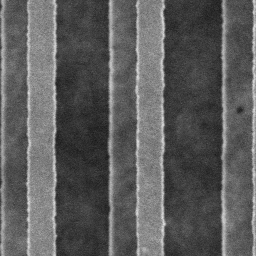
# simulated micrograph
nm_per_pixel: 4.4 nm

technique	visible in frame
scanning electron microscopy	lines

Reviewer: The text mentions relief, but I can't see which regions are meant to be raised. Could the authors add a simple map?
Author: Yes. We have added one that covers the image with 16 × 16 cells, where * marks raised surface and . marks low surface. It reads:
***....***....**
***....***....**
***....***....**
***....***....**
***....***....**
***....***....**
***....***....**
***....***....**
***....***....**
***....***....**
***....***....**
***....***....**
***....***....**
***....***....**
***....***....**
***....***....**